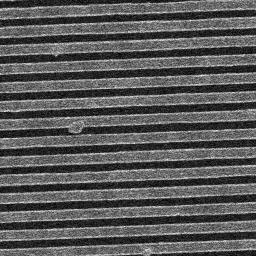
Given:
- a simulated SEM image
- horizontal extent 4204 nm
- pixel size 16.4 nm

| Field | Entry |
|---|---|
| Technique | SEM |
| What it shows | parallel lines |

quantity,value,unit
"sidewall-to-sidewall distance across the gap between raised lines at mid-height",152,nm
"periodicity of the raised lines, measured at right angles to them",18.5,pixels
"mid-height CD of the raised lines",154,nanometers